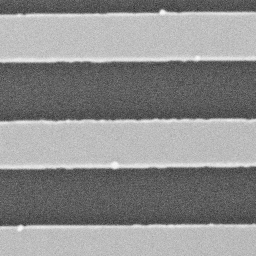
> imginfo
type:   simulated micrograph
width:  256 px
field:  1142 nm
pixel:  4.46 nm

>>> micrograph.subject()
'lines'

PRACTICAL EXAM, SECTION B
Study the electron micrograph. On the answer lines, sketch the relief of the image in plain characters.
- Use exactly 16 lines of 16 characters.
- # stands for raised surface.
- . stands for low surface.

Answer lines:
................
################
################
################
................
................
................
.........#######
################
################
##..............
................
................
................
################
################